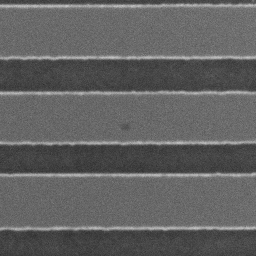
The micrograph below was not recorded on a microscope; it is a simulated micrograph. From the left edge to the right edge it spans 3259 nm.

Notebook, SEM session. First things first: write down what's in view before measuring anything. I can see lines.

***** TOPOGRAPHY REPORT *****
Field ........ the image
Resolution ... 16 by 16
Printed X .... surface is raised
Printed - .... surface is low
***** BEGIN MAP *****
XXXXXXXXXXXXXXXX
XXXXXXXXXXXXXXXX
XXXXXXXXXXXXXXXX
XXXXXXXXXXXXXXXX
----------------
----------------
XXXXXXXXXXXXXXXX
XXXXXXXXXXXXXXXX
XXXXXXXXXXXXXXXX
----------------
----------------
XXXXXXXXXXXXXXXX
XXXXXXXXXXXXXXXX
XXXXXXXXXXXXXXXX
----------------
----------------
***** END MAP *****